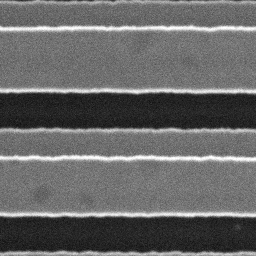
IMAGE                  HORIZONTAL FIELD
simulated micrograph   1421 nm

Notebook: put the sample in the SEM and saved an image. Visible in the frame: lines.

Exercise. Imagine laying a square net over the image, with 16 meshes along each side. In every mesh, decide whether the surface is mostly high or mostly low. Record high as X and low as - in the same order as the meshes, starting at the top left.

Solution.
XXXXXXXXXXXXXXXX
XXXXXXXXXXXXXXXX
XXXXXXXXXXXXXXXX
XXXXXXXXXXXXXXXX
XXXXXXXXXXXXXXXX
XXXXXXXXXXXXXXXX
----------------
----------------
XXXXXXXXXXXXXXXX
XXXXXXXXXXXXXXXX
XXXXXXXXXXXXXXXX
XXXXXXXXXXXXXXXX
XXXXXXXXXXXXXXXX
X--XXXX-XX-XX--X
----------------
----------------